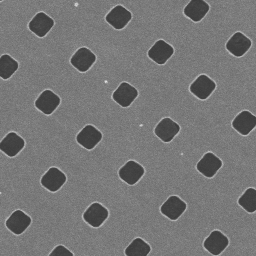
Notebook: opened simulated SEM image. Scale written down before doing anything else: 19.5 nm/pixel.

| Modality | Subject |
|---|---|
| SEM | a regular array of holes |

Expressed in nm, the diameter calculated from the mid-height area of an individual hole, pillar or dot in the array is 442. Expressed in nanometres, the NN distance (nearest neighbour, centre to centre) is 1070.